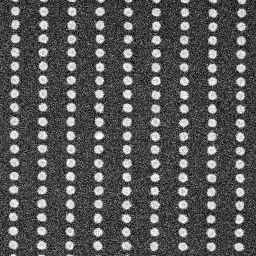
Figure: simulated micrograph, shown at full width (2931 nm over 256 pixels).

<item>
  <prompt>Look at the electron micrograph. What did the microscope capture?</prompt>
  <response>a regular array of raised bodies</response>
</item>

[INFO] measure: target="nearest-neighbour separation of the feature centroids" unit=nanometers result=155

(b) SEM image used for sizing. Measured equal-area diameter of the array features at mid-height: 89.5 nanometers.